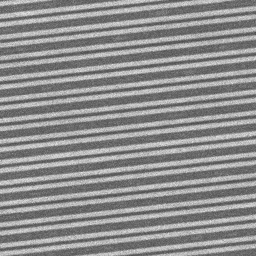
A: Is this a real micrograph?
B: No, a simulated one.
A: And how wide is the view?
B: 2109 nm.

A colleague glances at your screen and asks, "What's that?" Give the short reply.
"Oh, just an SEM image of parallel lines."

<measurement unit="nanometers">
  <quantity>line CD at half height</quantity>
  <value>32.7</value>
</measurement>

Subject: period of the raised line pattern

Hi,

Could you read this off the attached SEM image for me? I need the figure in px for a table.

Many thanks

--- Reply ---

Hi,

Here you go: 10.3